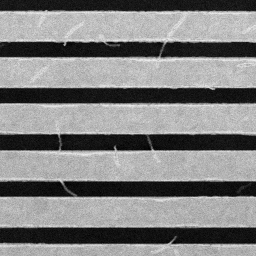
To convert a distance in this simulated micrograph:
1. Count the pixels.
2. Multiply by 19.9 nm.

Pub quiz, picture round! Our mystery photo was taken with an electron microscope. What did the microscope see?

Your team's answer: lines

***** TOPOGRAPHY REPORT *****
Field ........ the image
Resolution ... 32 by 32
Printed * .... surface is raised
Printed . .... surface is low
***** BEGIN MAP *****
................................
.....*.................*........
********************************
********************************
********************************
................................
................................
********************************
********************************
********************************
********************************
................................
................................
********************************
********************************
********************************
********************************
................................
................................
********************************
********************************
********************************
.......*....*************...****
................................
................................
********************************
********************************
********************************
................................
................................
.....................*..........
********************************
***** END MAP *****